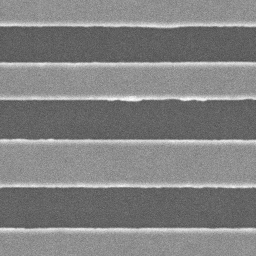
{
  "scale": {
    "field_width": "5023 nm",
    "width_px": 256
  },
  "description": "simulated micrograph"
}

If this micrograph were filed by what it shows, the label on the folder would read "lines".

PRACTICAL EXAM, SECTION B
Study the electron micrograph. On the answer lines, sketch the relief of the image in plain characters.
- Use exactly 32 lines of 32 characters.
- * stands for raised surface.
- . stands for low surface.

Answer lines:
********************************
********************************
********************************
................................
................................
................................
................................
................................
********************************
********************************
********************************
********************************
.............*****.....***......
................................
................................
................................
................................
..*...*.........................
********************************
********************************
********************************
********************************
********************************
................................
................................
................................
................................
................................
................................
********************************
********************************
********************************